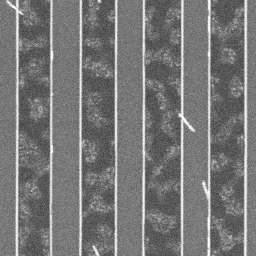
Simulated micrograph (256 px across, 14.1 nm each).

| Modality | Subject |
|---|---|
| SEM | one or a few lines or trenches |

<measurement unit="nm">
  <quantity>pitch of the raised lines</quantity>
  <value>907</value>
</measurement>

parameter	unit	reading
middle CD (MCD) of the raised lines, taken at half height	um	0.5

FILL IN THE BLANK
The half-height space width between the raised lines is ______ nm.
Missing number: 391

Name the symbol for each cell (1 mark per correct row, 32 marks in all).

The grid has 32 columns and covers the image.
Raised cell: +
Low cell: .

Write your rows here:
..++++....++++....+++++...+++++.
..++++....++++....+++++...+++++.
..++++....++++....+++++...+++++.
..++++....++++....+++++...+++++.
..++++....++++....+++++...+++++.
..++++....++++....+++++...+++++.
..++++....++++....+++++...+++++.
..++++....++++....+++++...+++++.
..++++....++++....+++++...+++++.
..++++....++++....+++++...+++++.
..++++....++++....+++++...+++++.
..++++....++++....+++++...+++++.
..++++....++++....+++++...+++++.
..++++....++++....+++++...+++++.
..++++....++++....+++++...+++++.
..++++....++++....+++++...+++++.
..++++....++++....+++++...+++++.
..++++....++++....+++++...+++++.
..++++....++++....+++++...+++++.
..++++....++++....+++++...+++++.
..++++....++++....+++++...+++++.
..++++....++++....+++++...+++++.
..++++....++++....+++++...+++++.
..++++....++++....+++++...+++++.
..++++....++++....+++++...+++++.
..++++....++++....+++++...+++++.
..++++....++++....+++++...+++++.
..++++....++++....+++++...+++++.
..++++....++++....+++++...+++++.
..++++....++++....+++++...+++++.
..++++....++++....+++++...+++++.
..++++....++++....+++++...+++++.